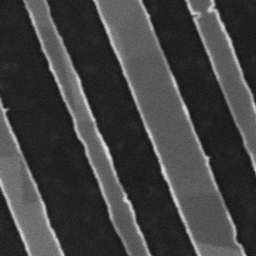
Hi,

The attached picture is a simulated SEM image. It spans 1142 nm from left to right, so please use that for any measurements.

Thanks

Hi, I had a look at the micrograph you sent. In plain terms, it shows one or a few lines or trenches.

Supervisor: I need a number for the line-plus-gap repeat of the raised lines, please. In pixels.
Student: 77.6